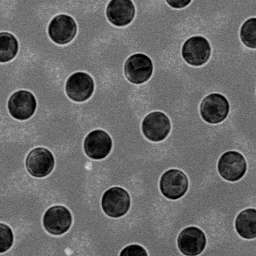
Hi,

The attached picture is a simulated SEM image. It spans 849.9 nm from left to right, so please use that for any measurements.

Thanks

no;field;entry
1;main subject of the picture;a regular array of holes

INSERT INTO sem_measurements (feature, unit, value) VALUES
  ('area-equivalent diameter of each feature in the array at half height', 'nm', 97.9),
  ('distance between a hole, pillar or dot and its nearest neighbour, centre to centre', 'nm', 200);